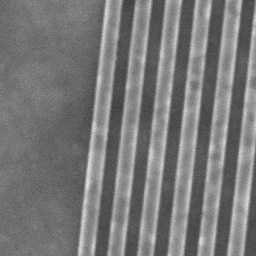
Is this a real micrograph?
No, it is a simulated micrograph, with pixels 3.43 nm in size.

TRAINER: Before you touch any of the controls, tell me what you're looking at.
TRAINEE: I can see parallel lines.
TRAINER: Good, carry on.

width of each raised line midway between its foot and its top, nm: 50.2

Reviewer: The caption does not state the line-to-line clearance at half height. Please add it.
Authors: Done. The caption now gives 14.6 px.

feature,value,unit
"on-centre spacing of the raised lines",102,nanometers